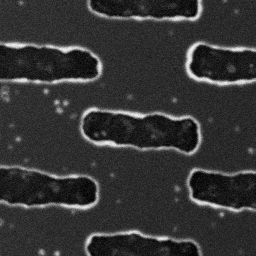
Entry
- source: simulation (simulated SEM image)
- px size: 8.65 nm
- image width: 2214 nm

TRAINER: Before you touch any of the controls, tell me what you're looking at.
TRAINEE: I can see holes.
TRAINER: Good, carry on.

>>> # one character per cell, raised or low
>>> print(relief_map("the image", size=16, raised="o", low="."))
oooooo......oooo
oooooooooooooooo
oooooooooooooooo
......oooooo....
......oooooo....
oooooooooooooooo
oooooooooooooooo
ooooo.......oooo
ooooo.......oooo
oooooooooooooooo
oooooooooooooooo
......oooooo....
......oooooo....
oooooooooooooooo
oooooooooooooooo
oooooo......oooo